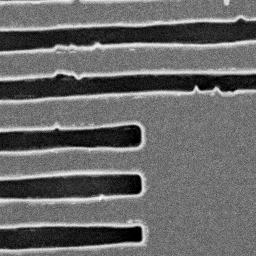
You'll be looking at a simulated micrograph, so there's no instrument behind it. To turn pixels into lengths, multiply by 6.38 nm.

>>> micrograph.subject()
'parallel lines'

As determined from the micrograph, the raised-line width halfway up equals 0.183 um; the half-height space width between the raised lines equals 133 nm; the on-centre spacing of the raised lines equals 319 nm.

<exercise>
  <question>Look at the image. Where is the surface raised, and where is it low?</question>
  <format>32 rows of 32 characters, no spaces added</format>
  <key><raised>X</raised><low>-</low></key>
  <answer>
XXXXXXXXXXXXXXXXXXXXXXXXXXXXXXXX
XXXXXXXXXXXXXXXXXXXXXXXXXXXXXXXX
XXXXXXXXXXXXXXXXXXXXXXXXXXXXXX--
XXXXXXX-------------------------
--------------------------------
----------------------------XXXX
-XXXXXXXXXXXXXXXXXXXXXXXXXXXXXXX
XXXXXXXXXXXXXXXXXXXXXXXXXXXXXXXX
XXXXXXXXXXXXXXXXXXXXXXXXXXXXXXXX
XXXXXXX--XX---------------------
--------------------------------
------------------------XXXXXXXX
----XXXXXXXXXXXXXXXXXXXXXXXXXXXX
XXXXXXXXXXXXXXXXXXXXXXXXXXXXXXXX
XXXXXXXXXXXXXXXXXXXXXXXXXXXXXXXX
XXXXXXXXXXXXXXXXXXXXXXXXXXXXXXXX
------------------XXXXXXXXXXXXXX
------------------XXXXXXXXXXXXXX
---------XX------XXXXXXXXXXXXXXX
XXXXXXXXXXXXXXXXXXXXXXXXXXXXXXXX
XXXXXXXXXXXXXXXXXXXXXXXXXXXXXXXX
XXXXXXXXXXXXXXXXXXXXXXXXXXXXXXXX
------------------XXXXXXXXXXXXXX
------------------XXXXXXXXXXXXXX
-----------------XXXXXXXXXXXXXXX
XXXXXXXXXXXXXXXXXXXXXXXXXXXXXXXX
XXXXXXXXXXXXXXXXXXXXXXXXXXXXXXXX
XXXXXXXXXXXXXXXXXXXXXXXXXXXXXXXX
------------------XXXXXXXXXXXXXX
------------------XXXXXXXXXXXXXX
----------------XXXXXXXXXXXXXXXX
XXXXXXXXXXXXXXXXXXXXXXXXXXXXXXXX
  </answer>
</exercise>